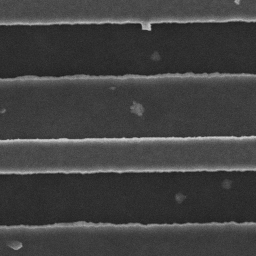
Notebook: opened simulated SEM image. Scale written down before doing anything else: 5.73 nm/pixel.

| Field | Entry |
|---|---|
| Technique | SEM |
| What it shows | lines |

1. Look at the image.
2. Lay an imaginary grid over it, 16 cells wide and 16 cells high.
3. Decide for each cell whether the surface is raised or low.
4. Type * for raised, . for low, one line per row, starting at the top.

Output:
****************
***......*......
................
................
................
****************
****************
****************
****************
****************
****************
................
................
................
****************
****************